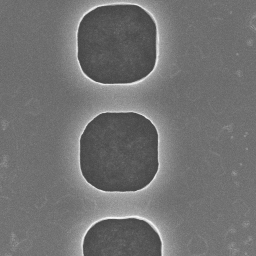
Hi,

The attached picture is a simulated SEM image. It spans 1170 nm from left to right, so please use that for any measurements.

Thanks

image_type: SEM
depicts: holes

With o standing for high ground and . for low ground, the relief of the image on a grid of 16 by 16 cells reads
oooooo...ooooooo
ooooo.....oooooo
ooooo.....oooooo
ooooo.....oooooo
ooooo....ooooooo
oooooooooooooooo
oooooooooooooooo
oooooo...ooooooo
ooooo.....oooooo
ooooo.....oooooo
ooooo.....oooooo
oooooo...ooooooo
oooooooooooooooo
oooooooooooooooo
ooooo.....oooooo
ooooo.....oooooo